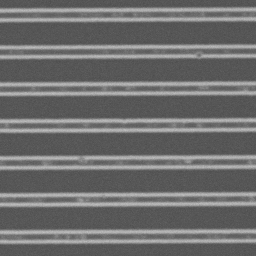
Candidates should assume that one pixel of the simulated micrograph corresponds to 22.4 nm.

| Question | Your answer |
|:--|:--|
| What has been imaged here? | parallel lines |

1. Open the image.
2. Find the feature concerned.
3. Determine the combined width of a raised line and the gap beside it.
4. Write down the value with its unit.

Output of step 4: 830 nanometers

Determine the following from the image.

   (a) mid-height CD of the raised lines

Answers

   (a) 233 nm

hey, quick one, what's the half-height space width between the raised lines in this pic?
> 595 nanometres